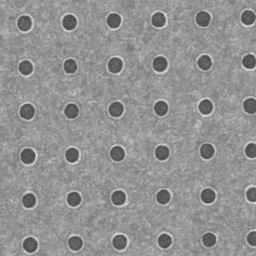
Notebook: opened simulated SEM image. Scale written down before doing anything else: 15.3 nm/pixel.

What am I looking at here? a regular array of holes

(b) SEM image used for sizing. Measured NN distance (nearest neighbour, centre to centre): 674 nanometres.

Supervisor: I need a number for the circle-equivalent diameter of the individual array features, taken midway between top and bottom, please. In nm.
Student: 240